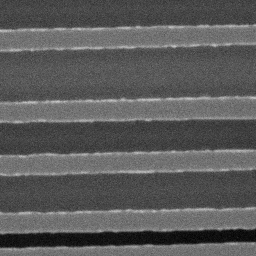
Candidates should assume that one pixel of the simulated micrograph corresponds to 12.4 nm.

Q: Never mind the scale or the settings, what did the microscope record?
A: lines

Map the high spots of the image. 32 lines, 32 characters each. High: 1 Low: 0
00000000000000000000000000000000
00000000000000000000000000000000
00000000000000000000000000000000
00000000000000111111111111111111
11111111111111111111111111111111
11111111111111111111111111111000
00000000000000000000000000000000
00000000000000000000000000000000
00000000000000000000000000000000
00000000000000000000000000000000
00000000000000000000000000000000
00000000000000000000000000000000
00000000000000010111111111111111
11111111111111111111111111111111
11111111111111111111111111111111
00000000000000000000000000000000
00000000000000000000000000000000
00000000000000000000000000000000
00000000000000000000000000000000
00011111111111111111111111111111
11111111111111111111111111111111
11111111111111111111000000000000
00000000000000000000000000000000
00000000000000000000000000000000
00000000000000000000000000000000
00000000000000000000000000000000
00000000011111111111111111111111
11111111111111111111111111111111
11111111111111111111111111111111
00000000000000000000000000000000
00000000000000000000000000001111
11111111111111111111111111111111